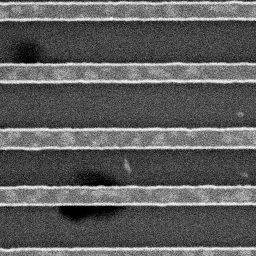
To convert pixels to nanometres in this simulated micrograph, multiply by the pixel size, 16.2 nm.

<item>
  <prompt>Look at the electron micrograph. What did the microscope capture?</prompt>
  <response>parallel lines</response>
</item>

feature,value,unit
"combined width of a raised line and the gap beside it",994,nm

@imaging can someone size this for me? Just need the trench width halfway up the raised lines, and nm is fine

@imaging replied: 709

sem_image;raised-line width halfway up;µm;0.283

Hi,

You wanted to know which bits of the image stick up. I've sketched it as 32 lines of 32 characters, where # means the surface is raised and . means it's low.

.###############################
################################
........#........##.............
................................
................................
................................
................................
................................
################################
################################
................................
................................
................................
................................
................................
................................
################################
################################
#####......##...................
................................
................................
................................
................................
################################
################################
########################........
................................
................................
................................
................................
................................
################################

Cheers